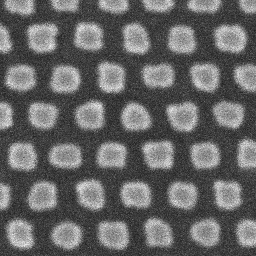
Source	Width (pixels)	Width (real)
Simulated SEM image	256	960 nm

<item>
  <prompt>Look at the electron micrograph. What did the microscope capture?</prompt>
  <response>a regular array of raised bodies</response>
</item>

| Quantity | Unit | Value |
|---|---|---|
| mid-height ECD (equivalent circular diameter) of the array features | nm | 99.9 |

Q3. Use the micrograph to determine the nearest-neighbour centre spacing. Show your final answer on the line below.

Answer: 164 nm